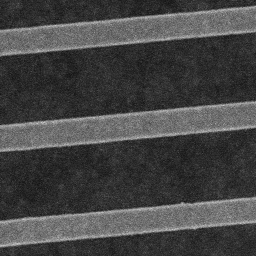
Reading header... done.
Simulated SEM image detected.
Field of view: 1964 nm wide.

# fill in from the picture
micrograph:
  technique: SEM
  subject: one or a few lines or trenches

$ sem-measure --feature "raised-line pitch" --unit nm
729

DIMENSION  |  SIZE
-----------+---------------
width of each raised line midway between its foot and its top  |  193 nm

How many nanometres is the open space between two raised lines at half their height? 532